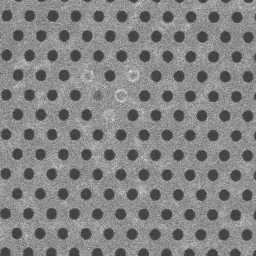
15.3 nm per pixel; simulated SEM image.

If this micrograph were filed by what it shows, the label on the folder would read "a regular array of holes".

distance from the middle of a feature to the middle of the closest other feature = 0.347 um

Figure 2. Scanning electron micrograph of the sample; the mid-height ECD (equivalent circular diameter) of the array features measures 178 nanometers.